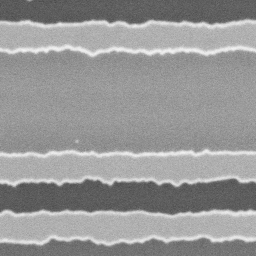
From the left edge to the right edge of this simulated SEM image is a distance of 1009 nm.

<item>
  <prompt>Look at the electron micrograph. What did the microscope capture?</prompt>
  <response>lines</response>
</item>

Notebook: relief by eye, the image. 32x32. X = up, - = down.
--------------------------------
--------------------------------
------------------------------XX
XXXXXXXXXXXXXXXXXXXXXXXXXXXXXXXX
XXXXXXXXXXXXXXXXXXXXXXXXXXXXXXXX
XXXXXXXXXXXXXXXXXXXXXXXXXXXXXXXX
-X---------XX---X-XXXX---XX-----
--------------------------------
--------------------------------
--------------------------------
--------------------------------
--------------------------------
--------------------------------
--------------------------------
--------------------------------
--------------------------------
--------------------------------
--------------------------------
--------------------------------
XXXXXXXXXXXXXXXXXXXXXXXXXXXXXXXX
XXXXXXXXXXXXXXXXXXXXXXXXXXXXXXXX
XXXXXXXXXXXXXXXXXXXXXXXXXXXXXXXX
XXXXXXXXXXX-XXXXXXXXXXXXXXX---XX
--------------------------------
--------------------------------
--------------------------------
XX---X-XXXX-XXX-XX-------XXXXXXX
XXXXXXXXXXXXXXXXXXXXXXXXXXXXXXXX
XXXXXXXXXXXXXXXXXXXXXXXXXXXXXXXX
XXXXXXXXXXXXXXXXXXXXXXXXXXXXXXXX
-------------X------------------
--------------------------------